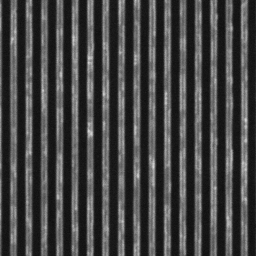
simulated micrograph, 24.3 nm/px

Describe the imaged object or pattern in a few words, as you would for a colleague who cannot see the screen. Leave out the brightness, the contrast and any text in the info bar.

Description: parallel lines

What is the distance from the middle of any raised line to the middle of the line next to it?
15.4 px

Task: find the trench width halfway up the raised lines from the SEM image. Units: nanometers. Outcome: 240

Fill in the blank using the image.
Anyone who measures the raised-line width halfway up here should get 131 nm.